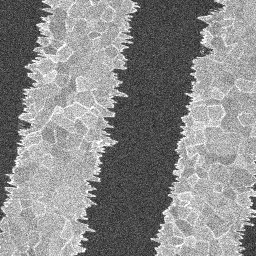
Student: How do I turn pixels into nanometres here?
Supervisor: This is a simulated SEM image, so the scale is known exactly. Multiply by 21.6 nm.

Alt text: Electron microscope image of one or a few lines or trenches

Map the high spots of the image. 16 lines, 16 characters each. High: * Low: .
...*****......**
...*****.....***
...*****.....***
..******.....***
..*****.....****
..*****.....****
..*****.....****
..*****.....****
.******....*****
.*****.....*****
.*****.....*****
.*****.....*****
******.....*****
*****.....******
*****.....*****.
*****.....*****.